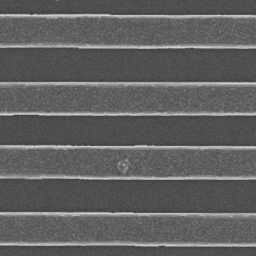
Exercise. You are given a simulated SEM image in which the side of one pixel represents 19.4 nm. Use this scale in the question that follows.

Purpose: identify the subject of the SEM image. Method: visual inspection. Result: lines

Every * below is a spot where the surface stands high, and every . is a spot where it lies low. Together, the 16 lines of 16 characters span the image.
................
****************
****************
................
................
****************
****************
................
................
****************
****************
................
................
****************
****************
................